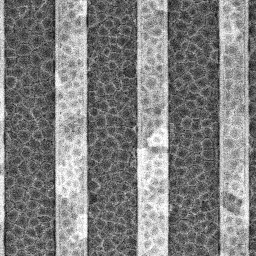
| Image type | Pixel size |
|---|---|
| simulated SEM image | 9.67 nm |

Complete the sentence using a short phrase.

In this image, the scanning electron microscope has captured one or a few lines or trenches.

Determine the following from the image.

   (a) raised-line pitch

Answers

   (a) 0.788 micrometres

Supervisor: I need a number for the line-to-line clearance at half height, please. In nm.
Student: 530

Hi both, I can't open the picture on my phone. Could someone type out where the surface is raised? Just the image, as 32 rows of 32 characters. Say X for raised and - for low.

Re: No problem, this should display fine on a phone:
-------XXXX------XXXX-------XXX-
-------XXXX------XXXX-------XXX-
-------XXXX------XXXX-------XXX-
-------XXXX------XXXX-------XXX-
-------XXXX------XXXX-------XXX-
-------XXXX------XXXX-------XXX-
-------XXXX------XXXX-------XXX-
-------XXXX------XXXX-------XXX-
-------XXXX------XXXX-------XXX-
-------XXXX------XXXX-------XXX-
-------XXXX------XXXX-------XXX-
-------XXXX------XXXX-------XXX-
-------XXXX------XXXX-------XXX-
-------XXXX------XXXX-------XXX-
-------XXXX------XXXX-------XXX-
-------XXXX------XXXX-------XXX-
-------XXXX------XXXX-------XXX-
-------XXXX------XXXX-------XXX-
-------XXXX------XXXX-------XXX-
-------XXXX------XXXX-------XXX-
-------XXXX------XXXX-------XXX-
-------XXXX------XXXX-------XXX-
-------XXXX------XXXX-------XXX-
-------XXXX------XXXX-------XXX-
-------XXXX------XXXX-------XXX-
-------XXXX------XXXX-------XXX-
-------XXXX------XXXX-------XXX-
-------XXXX------XXXX-------XXX-
-------XXXX------XXXX-------XXX-
-------XXXX------XXXX-------XXX-
-------XXXX------XXXX-------XXX-
-------XXXX------XXXX-------XXX-